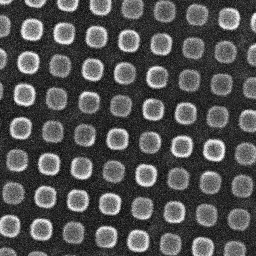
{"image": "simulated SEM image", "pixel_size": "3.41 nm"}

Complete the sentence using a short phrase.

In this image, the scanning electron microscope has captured a regular array of raised bodies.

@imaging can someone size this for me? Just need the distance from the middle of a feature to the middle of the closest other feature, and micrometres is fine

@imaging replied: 0.11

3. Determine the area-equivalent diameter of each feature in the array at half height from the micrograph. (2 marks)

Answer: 72.6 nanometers